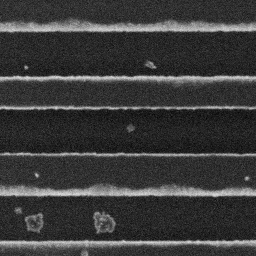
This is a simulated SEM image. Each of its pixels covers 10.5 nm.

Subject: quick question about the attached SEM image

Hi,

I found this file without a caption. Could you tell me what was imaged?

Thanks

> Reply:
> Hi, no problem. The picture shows lines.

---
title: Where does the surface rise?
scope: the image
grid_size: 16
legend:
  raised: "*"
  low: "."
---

****************
****************
................
................
................
****************
****************
................
................
................
****************
****************
................
................
................
****************